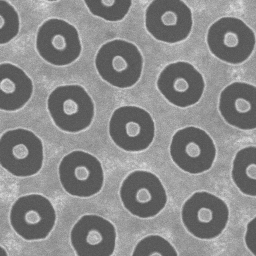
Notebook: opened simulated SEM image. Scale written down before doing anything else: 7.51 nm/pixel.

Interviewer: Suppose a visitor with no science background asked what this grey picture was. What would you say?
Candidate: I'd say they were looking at a regular array of ring-shaped grooves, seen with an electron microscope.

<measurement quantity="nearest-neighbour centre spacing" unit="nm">486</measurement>